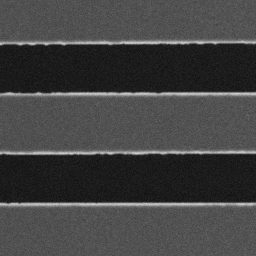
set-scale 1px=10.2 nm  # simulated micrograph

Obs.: lines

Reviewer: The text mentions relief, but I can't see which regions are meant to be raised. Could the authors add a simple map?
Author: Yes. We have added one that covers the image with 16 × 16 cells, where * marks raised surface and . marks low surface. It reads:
****************
****************
****************
................
................
................
****************
****************
****************
****************
................
................
................
****************
****************
****************